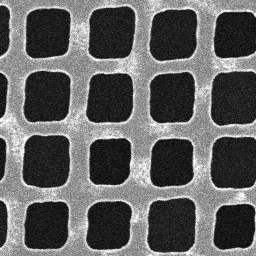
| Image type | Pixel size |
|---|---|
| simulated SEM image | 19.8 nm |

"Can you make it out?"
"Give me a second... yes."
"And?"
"a regular array of holes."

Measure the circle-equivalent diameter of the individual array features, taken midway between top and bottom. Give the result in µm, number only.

1.03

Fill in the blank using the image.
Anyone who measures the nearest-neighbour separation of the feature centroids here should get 1230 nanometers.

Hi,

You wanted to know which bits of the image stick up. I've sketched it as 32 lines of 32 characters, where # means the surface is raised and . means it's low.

################################
.###.....###.....###....####...#
.##......##......##......##.....
.##......##......##......##.....
.##......##......##......##.....
.##......##......##......##.....
.##.....###.....###.....###.....
####################..##########
################################
.###.....###....###.....###.....
.##......##......##.....###.....
.##......##......##.....##......
.##......##......##.....##......
.##......##......##.....##......
###.....###.....###.....##......
###########################....#
################################
.##......###....####...####.....
.##......##.....###.....###.....
.##......##......##.....##......
.##......##.....###.....##......
.##......##.....###.....##......
###.....###.....###.....##......
#####.#####################....#
################################
.###....####....###.....######.#
.##......##......##......##.....
.##......##.....##.......##.....
.##......##.....###.....###.....
.##......##.....##......###.....
.##.....###.....##......###....#
####################...#########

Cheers